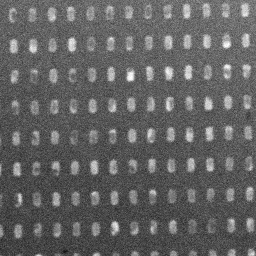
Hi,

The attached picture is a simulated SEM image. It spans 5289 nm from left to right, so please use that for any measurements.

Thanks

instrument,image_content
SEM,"a regular array of raised bodies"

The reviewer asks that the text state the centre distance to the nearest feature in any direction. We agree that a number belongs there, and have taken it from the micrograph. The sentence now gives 397 nm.